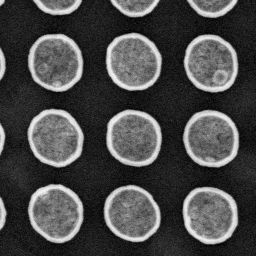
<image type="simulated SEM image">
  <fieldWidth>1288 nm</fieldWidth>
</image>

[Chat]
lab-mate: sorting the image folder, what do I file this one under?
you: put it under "a regular array of raised bodies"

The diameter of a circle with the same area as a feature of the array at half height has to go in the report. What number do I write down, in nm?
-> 267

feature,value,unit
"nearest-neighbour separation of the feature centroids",380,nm